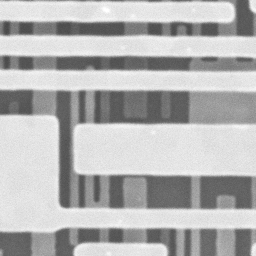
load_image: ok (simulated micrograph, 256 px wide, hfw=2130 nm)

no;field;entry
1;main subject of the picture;wiring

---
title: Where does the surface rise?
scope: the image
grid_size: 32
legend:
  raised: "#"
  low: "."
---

#############################..#
#############################...
#############################...
................................
................................
################################
################################
................................
................................
################################
################################
................................
................................
................................
................................
#######.........................
#######..#######################
#######..#######################
#######..#######################
#######..#######################
#######..#######################
#######...######################
#######.........................
#######.........................
#######.........................
#######.........................
################################
################################
########........................
................................
..........####..................
.........############..........#